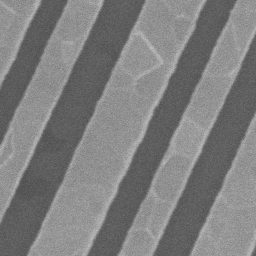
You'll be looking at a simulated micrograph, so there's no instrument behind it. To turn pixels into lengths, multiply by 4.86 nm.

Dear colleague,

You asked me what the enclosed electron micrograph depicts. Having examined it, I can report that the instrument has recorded lines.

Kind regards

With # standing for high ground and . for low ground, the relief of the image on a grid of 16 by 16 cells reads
##..##...####..#
##..##..####..##
#..##...####..##
#..##...###..##.
..##...####..##.
..##...###..##..
.##...####..##..
.##...###..##...
##...####..##..#
##...###..##...#
##..####..##..##
#...###..###..##
#..####..##...##
...####..##..###
..####..##...###
..####..##..####